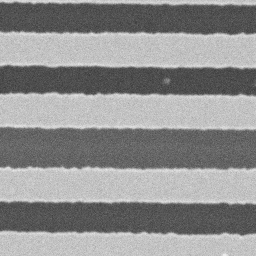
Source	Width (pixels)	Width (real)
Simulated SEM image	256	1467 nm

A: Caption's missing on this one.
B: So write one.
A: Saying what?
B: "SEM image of lines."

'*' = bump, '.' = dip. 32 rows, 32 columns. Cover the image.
.....................*.....*.***
................................
................................
................................
********************************
********************************
********************************
********************************
..............................*.
................................
................................
................................
********************************
********************************
********************************
********************************
................................
................................
................................
................................
................................
********************************
********************************
********************************
********************************
................................
................................
................................
................................
********************************
********************************
********************************